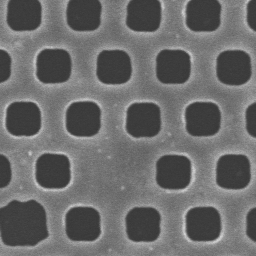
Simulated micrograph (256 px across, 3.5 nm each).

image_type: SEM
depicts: a regular array of holes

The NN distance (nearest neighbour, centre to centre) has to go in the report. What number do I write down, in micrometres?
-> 0.21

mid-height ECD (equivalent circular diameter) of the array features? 129 nanometres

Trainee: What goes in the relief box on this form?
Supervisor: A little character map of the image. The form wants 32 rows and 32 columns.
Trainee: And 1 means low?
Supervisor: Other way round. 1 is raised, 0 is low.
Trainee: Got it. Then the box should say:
10000111000001110000111000011110
10000111000001110000111000001110
10000111000001110000111000001110
10000111100011110000111100011110
11111111111111111111111111111111
11111111111111111111111111111111
01111000111110001111000111110001
01111000011100001111000011100001
01110000011100001110000011100001
01111000011100001111000011100001
11111111111110011111111111110011
11111111111111111111111111111111
11111111111111111111111111111111
10000111100011110000111000011110
10000111000011110000111000001110
10000111000001110000111000001110
10000111100011110000111100011110
11111111111111111111111111111111
11111111111111111111111111111111
01111000111111111111000111110001
01110000011111111110000011100001
01110000011111111110000011100001
01111000011111111111000011100001
11111100111111111111100111110011
11111111111111111111111111111111
10000111111111111111111111111111
00000011100011110000111100011110
00000011000001110000111000001110
00000011000001110000111000001110
00000011000011110000111100011110
10001111111111111111111111111111
11111111111111111111111111111111